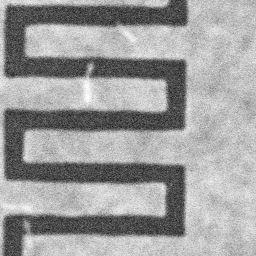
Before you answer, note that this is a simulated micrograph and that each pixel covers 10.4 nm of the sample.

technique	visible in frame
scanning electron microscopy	groups of lines, slits or small figures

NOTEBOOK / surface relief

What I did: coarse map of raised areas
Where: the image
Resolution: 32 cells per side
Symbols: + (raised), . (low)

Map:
+.++++..+++++++++++++...++++++++
+.......................++++++++
........................++++++++
....++++++++++++++++++++++++++++
...+++++++++++++++++++++++++++++
...+++++++++++++++++++++++++++++
...+++++++++++++++++++++++++++++
.......................+++++++++
........................++++++++
........................++++++++
+++++++++++++++++++++...++++++++
+++++++++++++++++++++...++++++++
+++++++++++++++++++++...++++++++
+.+++++++++++++++++++...++++++++
.......................+++++++++
.......................+++++++++
...++++++....+++.......+++++++++
...+++++++++++++++++++++++++++++
...+++++++++++++++++++++++++++++
...+++++++++++++++++++++++++++++
......................++++++++++
.......................+++++++++
+......................+++++++++
++++++++++++++++++++...+++++++++
++++++++++++++++++++...+++++++++
++++++++++++++++++++...+++++++++
+++++++++++++++++++++..+++++++++
.......................+++++++++
.......................+++++++++
...+...++++............+++++++++
...+++++++++++++++++++++++++++++
...+++++++++++++++++++++++++++++